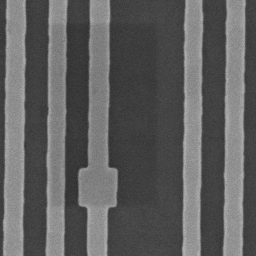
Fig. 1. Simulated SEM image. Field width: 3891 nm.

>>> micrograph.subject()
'wiring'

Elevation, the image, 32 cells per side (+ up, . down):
.++...++...+++.........++...+++.
.++...++...+++.........++...+++.
.++...++...+++.........++...+++.
.++...++...+++.........++...+++.
.++...++...+++.........++...+++.
.++...++...+++.........++...+++.
.++...++...+++.........++...+++.
.++...++...+++.........++...+++.
.++...++...+++.........++...+++.
.++...++...+++.........++...++..
.++...++...+++.........++...+++.
.++...++...+++.........++...+++.
.++...++...+++.........++...++..
.++...++...+++.........++...++..
.++...++...++..........++...++..
.++...++...++..........++...++..
.++...++...++..........++...++..
.++...++...++..........++...++..
.++...++...++..........++...++..
.++...++...++..........++...++..
.++...++...+++.........++...++..
.++...++..+++++........++...++..
.++...++..+++++........++...++..
.++...++..+++++........++...++..
.++...++..++++.........++...++..
.++...++..++++.........++...++..
.++...++...++..........++...++..
+++...++...++..........++...++..
+++...++...++..........++...++..
.++...++...++..........++...++..
+++...++...++..........++...++..
+++...++...++..........++...++..